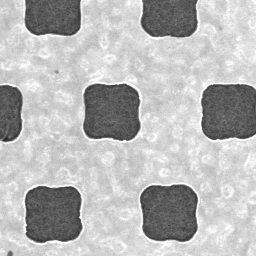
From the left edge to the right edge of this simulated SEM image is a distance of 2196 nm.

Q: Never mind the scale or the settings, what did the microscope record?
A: holes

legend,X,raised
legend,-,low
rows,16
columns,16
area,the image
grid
XX---XXXX---XXXX
XX---XXXX---XXXX
XXXXXXXXXXXXXXXX
XXXXXXXXXXXXXXXX
XXXXXXXXXXXXXXXX
-XXXXX--XXXXX---
-XXXX----XXXX---
-XXXX----XXXX---
-XXXXX--XXXXX---
XXXXXXXXXXXXXXXX
XXXXXXXXXXXXXXXX
XXXXXXXXXXXXXXXX
XX---XXXX---XXXX
XX---XXXX---XXXX
XX---XXXX---XXXX
XXXXXXXXXXXXXXXX